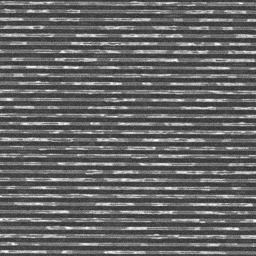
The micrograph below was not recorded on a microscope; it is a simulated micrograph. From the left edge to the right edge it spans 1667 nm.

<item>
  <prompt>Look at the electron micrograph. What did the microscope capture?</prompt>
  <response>parallel lines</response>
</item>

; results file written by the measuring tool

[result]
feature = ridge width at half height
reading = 17.1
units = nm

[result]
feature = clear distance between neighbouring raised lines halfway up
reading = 33.4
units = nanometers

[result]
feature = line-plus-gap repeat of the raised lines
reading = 52.2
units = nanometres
